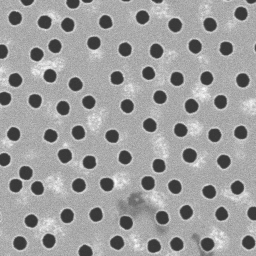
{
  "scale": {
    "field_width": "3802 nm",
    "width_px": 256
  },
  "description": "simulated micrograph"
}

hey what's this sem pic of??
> a regular array of holes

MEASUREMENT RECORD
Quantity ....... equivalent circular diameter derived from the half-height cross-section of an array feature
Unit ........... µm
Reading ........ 0.206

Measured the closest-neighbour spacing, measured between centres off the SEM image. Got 377 nm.